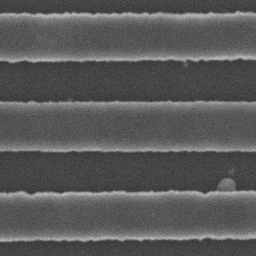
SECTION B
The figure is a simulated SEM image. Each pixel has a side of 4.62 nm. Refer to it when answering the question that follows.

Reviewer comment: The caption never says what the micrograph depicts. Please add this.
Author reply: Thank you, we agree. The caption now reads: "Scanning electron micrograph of lines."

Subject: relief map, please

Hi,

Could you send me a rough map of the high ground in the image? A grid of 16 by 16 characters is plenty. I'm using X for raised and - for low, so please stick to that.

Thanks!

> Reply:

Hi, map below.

----------------
XXXXXXXXXXXXXXXX
XXXXXXXXXXXXXXXX
XXXXXXXXXXXXXXXX
----------------
----------------
XXXXXXXXXXXXXXXX
XXXXXXXXXXXXXXXX
XXXXXXXXXXXXXXXX
----------------
----------------
----------------
XXXXXXXXXXXXXXXX
XXXXXXXXXXXXXXXX
XXXXXXXXXXXXXXXX
----------------